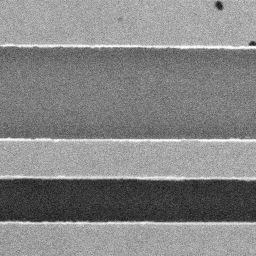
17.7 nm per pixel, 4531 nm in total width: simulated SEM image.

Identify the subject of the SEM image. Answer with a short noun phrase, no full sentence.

lines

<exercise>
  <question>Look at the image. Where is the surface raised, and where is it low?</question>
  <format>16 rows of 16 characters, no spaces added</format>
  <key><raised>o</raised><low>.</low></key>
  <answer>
oooooooooooooooo
oooooooooooooooo
oooooooooooooooo
................
................
................
................
................
................
oooooooooooooooo
oooooooooooooooo
................
................
................
oooooooooooooooo
oooooooooooooooo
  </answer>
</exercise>